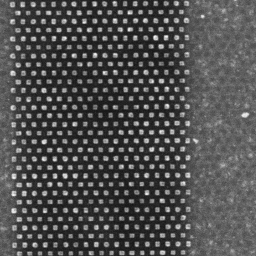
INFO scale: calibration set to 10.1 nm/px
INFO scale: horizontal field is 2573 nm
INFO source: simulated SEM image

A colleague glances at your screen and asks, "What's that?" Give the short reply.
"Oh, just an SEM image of a regular array of raised bodies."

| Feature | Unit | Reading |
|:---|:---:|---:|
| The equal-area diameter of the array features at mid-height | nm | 45.4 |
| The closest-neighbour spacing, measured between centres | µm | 0.0981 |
